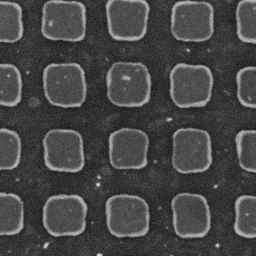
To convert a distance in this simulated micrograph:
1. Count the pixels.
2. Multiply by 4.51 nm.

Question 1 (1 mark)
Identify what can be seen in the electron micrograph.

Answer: a regular array of raised bodies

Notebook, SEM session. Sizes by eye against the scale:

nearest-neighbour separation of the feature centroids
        62.8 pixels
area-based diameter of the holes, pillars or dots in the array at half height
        196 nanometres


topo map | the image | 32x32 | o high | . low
oo....oooo....oooo....oooo....oo
ooo..ooooo...ooooo....oooo....oo
ooo..oooooo...oooo....oooo....oo
ooo..oooooo...oooo...ooooo....oo
ooo...oooo....oooo....oooo....oo
................................
................................
................................
oo....oooo....oooo....oooo.....o
oo...ooooo....ooooo..ooooo....oo
ooo...ooooo...ooooo...oooo....oo
ooo...ooooo..oooooo..ooooo....oo
oo....ooooo...oooo....oooo....oo
................................
................................
................................
oo....oooo....oooo....oooo....oo
oo...ooooo....ooooo...oooo....oo
oo....oooo....oooo....oooo....oo
oo....oooo....oooo....oooo....oo
oo....oooo....oooo....oooo....oo
.......................o........
................................
................................
oo............ooo.....ooo.......
ooo...oooo...ooooo....oooo....oo
ooo..oooooo..oooooo...oooo....oo
ooo...ooooo...oooo....oooo....oo
ooo...ooooo...oooo....oooo....oo
...............oo......o........
................................
................................